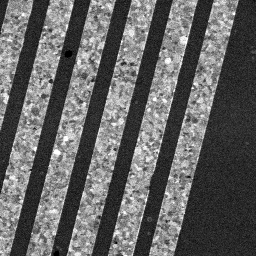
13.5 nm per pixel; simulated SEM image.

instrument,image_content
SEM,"parallel lines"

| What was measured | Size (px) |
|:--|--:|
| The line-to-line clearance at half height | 16.4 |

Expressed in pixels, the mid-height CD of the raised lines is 23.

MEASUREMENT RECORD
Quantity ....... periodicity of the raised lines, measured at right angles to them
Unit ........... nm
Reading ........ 536